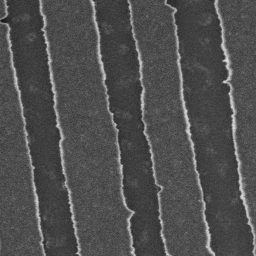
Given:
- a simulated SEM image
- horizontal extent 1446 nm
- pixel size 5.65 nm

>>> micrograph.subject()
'one or a few lines or trenches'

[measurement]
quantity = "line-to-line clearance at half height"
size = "196 nm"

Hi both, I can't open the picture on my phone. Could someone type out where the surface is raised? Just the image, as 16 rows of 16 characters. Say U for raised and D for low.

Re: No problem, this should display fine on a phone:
DDDUUUDDUUUDDDUU
DDDUUUDDUUUDDDUU
UDDUUUDDUUUDDDUU
UDDUUUDDDUUDDDUU
UDDUUUDDDUUDDDUU
UDDUUUUDDUUDDDUU
UDDUUUUDDUUUDDUU
UUDDUUUDDUUUDDDU
UUDDUUUDDUUUDDDU
UUDDUUUDDUUUDDDU
UUDDUUUUDDUUDDDU
UUDDUUUUDDUUUDDU
UUDDUUUUDDUUUDDU
UUDDDUUUDDUUUDDU
UUUDDUUUDDUUUDDD
UUUDDUUUDDUUUDDD